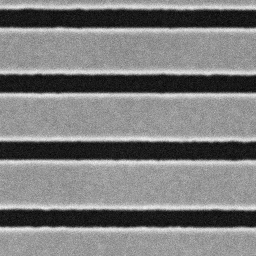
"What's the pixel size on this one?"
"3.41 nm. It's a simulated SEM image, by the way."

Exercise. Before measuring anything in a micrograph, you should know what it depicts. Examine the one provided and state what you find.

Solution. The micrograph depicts lines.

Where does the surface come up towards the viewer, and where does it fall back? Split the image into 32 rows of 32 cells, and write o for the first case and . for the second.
oooooooooooooooooooooooooooooooo
................................
................................
oo.....o........................
oooooooooooooooooooooooooooooooo
oooooooooooooooooooooooooooooooo
oooooooooooooooooooooooooooooooo
oooooooooooooooooooooooooooooooo
oooooooooooooooooooooooooooooooo
................................
................................
................................
oooooooooooooooooooooooooooooooo
oooooooooooooooooooooooooooooooo
oooooooooooooooooooooooooooooooo
oooooooooooooooooooooooooooooooo
oooooooooooooooooooooooooooooooo
oooooooooooooooooooooooooooooooo
................................
................................
oooooooooooooooooooooooooooooooo
oooooooooooooooooooooooooooooooo
oooooooooooooooooooooooooooooooo
oooooooooooooooooooooooooooooooo
oooooooooooooooooooooooooooooooo
oooooooooooooooooooooooooooooooo
................................
................................
ooooooooooooooo..ooo.ooo.....oo.
oooooooooooooooooooooooooooooooo
oooooooooooooooooooooooooooooooo
oooooooooooooooooooooooooooooooo